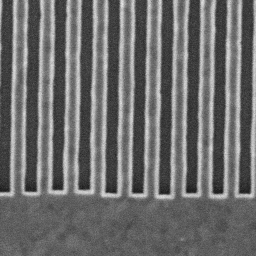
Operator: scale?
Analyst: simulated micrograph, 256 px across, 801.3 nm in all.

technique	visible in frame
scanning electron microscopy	parallel lines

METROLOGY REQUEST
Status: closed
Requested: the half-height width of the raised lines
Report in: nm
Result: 36.8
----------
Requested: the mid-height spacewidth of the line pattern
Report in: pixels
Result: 14.5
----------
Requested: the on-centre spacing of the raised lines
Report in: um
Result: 0.0837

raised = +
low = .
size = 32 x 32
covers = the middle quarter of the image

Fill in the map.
.+++....++....+++....+++....++..
.+++....++....+++....+++....++..
.+++...+++....+++....+++....++..
.+++...+++....+++....+++....++..
.+++...+++....+++....+++....++..
.+++...+++....+++....+++....++..
.+++...+++....+++....+++....++..
.+++...+++....+++....+++...+++..
.++....+++....+++....+++...+++..
.++....+++....+++....+++...+++..
.++....+++....+++....+++...+++..
.++....+++....+++....+++...+++..
+++....+++....+++....+++...+++..
+++....+++....+++....+++...+++..
+++....+++....+++....+++...+++..
.++....+++....+++....+++...+++..
.+++...+++....+++....++....+++..
.++....+++....+++....++....+++..
.++....+++....+++....++....+++..
.++....+++....+++....++....+++..
.++....+++....+++....++....+++..
+++....+++....+++....++....+++..
+++....+++....+++...+++....+++..
+++....+++....+++...+++....+++..
+++....+++....+++...+++....+++..
+++....+++....+++...+++....+++..
+++....+++....+++...+++....+++..
+++....+++....+++...+++....+++..
+++....+++....+++...+++....+++..
+++....+++....+++...+++....+++..
+++....+++....+++...+++....+++..
+++....+++....+++...+++....+++..